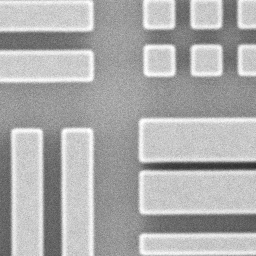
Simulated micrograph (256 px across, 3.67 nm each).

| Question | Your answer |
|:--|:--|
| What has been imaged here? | groups of lines, slits or small figures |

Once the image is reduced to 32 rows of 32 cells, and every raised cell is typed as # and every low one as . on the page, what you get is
###########.......####..####..##
###########.......####..####..##
###########.......####..####..##
###########.......###...###.....
................................
................................
###########.......####..####..##
############......####..####..##
############......####..####..##
############....................
................................
................................
................................
................................
................................
..................##############
..###...###.......##############
..###...###......###############
..###...###......###############
..###...###......###############
..###...###.....................
..###...###.......##############
..###...###.......##############
..###...###.......##############
..###...###.......##############
..###...###.......##############
..###...###.......##############
..###...###.....................
..###...###.....................
..###...###.......##############
..###...###.......##############
..###...####......##############